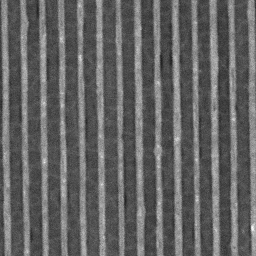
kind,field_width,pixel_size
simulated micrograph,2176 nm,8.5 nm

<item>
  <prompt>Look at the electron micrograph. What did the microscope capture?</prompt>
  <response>parallel lines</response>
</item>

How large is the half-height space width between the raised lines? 13.5 pixels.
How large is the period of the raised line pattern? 161 nm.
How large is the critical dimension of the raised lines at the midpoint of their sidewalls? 53.1 nanometres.